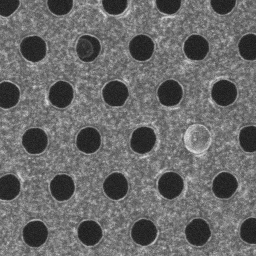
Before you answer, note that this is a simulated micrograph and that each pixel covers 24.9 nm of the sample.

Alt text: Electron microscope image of a regular array of holes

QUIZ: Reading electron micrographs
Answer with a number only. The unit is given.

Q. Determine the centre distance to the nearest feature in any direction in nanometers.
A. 1320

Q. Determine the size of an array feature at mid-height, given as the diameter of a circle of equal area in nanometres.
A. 668